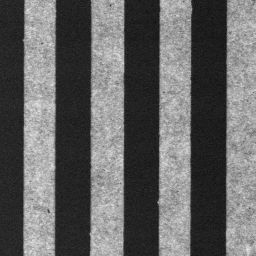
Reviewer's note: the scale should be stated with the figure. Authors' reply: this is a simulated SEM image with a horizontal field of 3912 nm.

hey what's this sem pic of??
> one or a few lines or trenches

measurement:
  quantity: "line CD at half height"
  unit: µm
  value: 0.476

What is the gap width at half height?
548 nanometers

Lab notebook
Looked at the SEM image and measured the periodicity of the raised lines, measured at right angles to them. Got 1020 nm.